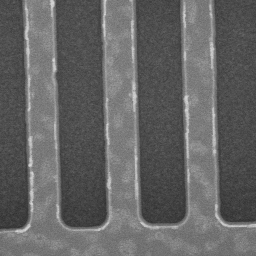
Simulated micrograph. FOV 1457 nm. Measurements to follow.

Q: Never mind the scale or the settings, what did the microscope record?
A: one or a few lines or trenches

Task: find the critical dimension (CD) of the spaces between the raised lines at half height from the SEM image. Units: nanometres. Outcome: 270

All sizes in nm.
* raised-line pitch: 450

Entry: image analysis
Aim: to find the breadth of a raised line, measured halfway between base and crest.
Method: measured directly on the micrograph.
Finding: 0.179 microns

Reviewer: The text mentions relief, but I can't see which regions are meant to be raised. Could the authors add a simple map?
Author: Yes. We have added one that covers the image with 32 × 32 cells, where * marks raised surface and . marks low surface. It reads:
...****......****......****.....
...****......****......****.....
...****......****......****.....
...****......****......****.....
...****......****......****.....
...****......****......****.....
...****......****......****.....
...****......****......****.....
...****......****......****.....
...****......****......****.....
...****......****......****.....
...****......****......****.....
...****......****......****.....
...****......****......****.....
...****......****......****.....
...****......****......****.....
...****......****......****.....
....***......****......****.....
....***......****......****.....
....***......****......****.....
....***......****......****.....
....***......****......****.....
....***......****......****.....
....***......****......****.....
....***......****......****.....
....***......****......****.....
....***......****......****.....
....****.....*****.....*****....
...******...********************
********************************
********************************
********************************